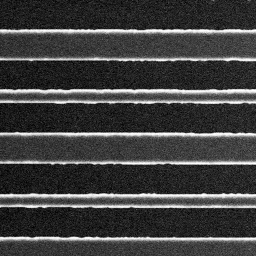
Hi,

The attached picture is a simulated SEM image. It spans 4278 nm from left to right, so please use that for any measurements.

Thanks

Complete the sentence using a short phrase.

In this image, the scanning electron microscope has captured lines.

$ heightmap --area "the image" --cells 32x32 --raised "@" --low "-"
--------------------------------
--------------------------------
--------------------------------
--------------------------------
@@@@@@@@@@@@@@@@@@@@@@@@@@@@@@@@
@@@@@@@@@@@@@@@@@@@@@@@@@@@@@@@@
@@@@@@@@@@@@@@@@@@@@@@@@@@@@@@@@
---@---------------@@----------@
--------------------------------
--------------------------------
--------------------------------
@@@@@@@@@@@@@@@@@@@@@@@@@@@@@@@@
@@@@@@@@@@@@@@@@@@@@@@@@@@@@@@@@
--------------------------------
--------------------------------
--------------------------------
--------------------------------
@@@@@@@@@@@@@@@@@@@@@@@@@@@@@@@@
@@@@@@@@@@@@@@@@@@@@@@@@@@@@@@@@
@@@@@@@@@@@@@@@@@@@@@@@@@@@@@@@@
--------------------------------
--------------------------------
--------------------------------
--------------------------------
@@@@@@@@@@@@@@@@@@@@@@@@@@@@@@@@
@@@@@@@@@@@@@@@@@@@@@@@@@@@@@@@@
--------------------------------
--------------------------------
--------------------------------
--------------------------------
@@@@@@@@@@@@@@@@@@@@@@@@@@@@@@@@
@@@@@@@@@@@@@@@@@@@@@@@@@@@@@@@@